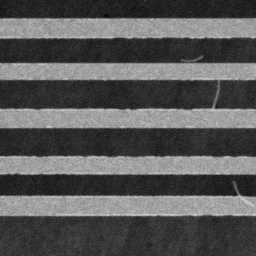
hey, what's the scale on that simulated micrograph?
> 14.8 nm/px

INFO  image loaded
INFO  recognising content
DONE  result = lines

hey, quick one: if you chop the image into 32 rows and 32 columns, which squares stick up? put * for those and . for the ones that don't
................................
................................
********************************
********************************
********************************
................................
................................
................................
********************************
********************************
................................
................................
................................
................................
********************************
********************************
................................
................................
................................
................................
********************************
********************************
................................
................................
.............................*..
********************************
********************************
................................
................................
................................
................................
................................